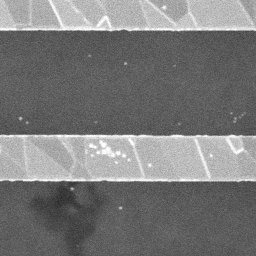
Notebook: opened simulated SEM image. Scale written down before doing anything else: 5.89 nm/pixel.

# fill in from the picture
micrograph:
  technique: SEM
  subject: lines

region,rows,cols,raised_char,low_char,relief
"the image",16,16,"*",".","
****************
****************
................
................
................
................
................
................
*************.*.
****************
****************
................
................
................
................
................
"